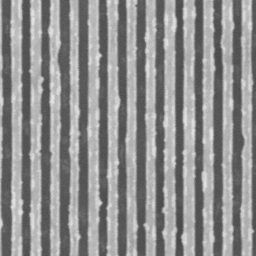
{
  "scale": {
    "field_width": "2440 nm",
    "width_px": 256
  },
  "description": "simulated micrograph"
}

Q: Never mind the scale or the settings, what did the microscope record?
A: parallel lines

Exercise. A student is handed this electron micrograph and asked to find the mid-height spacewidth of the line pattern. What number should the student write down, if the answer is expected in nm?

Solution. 85.7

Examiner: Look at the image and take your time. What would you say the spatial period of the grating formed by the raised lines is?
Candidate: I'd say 0.183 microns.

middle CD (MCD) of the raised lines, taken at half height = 94.1 nm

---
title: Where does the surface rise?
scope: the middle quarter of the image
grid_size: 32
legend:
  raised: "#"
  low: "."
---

..#...###..##...##..###..###..##
..##..###..##...##..###..###..##
..##..###..##...##...##..###..##
..##..###..##...##...##..###..##
..##..###..##...##...##..###..##
..##..###..##...##...##..###..##
..##..###..##...##...##..###..##
..##..###..##...##...##..###..##
..##..###..###..##...##..###..##
..##..###..###..##...##..###..##
..##..###..###..##..###..###..##
..##..###..##...##...##..###..##
..##..###..##...##..###..###..##
..##..###..##...##..###..###..##
..#...###..##...##..###..###..##
..##..###..##...##...##..###..##
..##..###..##...##...##..###..##
..##..###..##...##...##..###..##
..#...###..##..###...##..###..##
..##..###..##..###...##..###..##
..##..###..##...##...##..###..##
.###..###..##...##...##..###..##
..##..###..##...##...##..###..##
..##..###..##...##...##..###..##
..#...###..###..##...##..###..##
..##..###..##...##...##..###..##
..##..###..##...##...##..###..##
..##..###..##...##...##..###..##
..##..###..##...##...##..###..##
..##..###..##...##...##..###..##
..##..###..##...##...##..###..##
..##..###..##...##...##..###..##